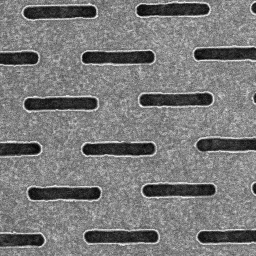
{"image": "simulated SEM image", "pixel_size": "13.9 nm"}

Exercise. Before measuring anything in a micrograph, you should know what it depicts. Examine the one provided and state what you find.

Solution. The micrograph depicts a regular array of holes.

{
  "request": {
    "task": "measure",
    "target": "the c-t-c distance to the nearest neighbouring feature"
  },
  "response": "1 microns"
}